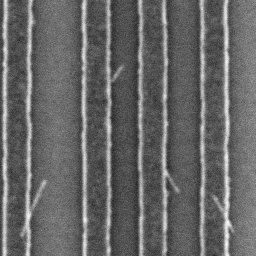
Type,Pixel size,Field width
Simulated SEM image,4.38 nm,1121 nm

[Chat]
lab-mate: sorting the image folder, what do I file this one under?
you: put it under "lines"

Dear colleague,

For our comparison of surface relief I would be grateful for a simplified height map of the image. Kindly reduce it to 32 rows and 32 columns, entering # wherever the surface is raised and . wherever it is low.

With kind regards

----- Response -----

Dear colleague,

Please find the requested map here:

.###......####...####....###....
.###......####...####....###....
.###......####....###....###....
####......####....###....###....
.###......####....###....###....
.###......####....###....###....
.###......####...####....###....
.###......####...####....###....
.###......####...####....###....
####......####...####....###....
####......####...####....###....
####......####....###....###....
####......####....###....###....
.###......####...####....###....
####......####...####....####...
####......####...####....####...
####......####....###....####...
####......####....###....###....
.###......####...####....###....
.###......####...####....###....
####......####...####....###....
####......####....###....###....
####......####....###....###....
.###......####....###....###....
####......####....###....####...
####......####....###....####...
####......####....###....###....
####......####....###....####...
####.......###....###....####...
####......####....###....###....
####......####....###....###....
####......####....###....###....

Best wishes